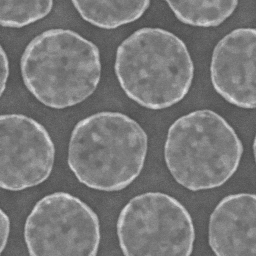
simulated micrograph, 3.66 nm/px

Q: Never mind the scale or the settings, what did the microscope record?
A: raised bodies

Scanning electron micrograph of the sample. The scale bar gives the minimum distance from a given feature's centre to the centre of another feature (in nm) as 344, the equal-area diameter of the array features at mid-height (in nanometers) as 282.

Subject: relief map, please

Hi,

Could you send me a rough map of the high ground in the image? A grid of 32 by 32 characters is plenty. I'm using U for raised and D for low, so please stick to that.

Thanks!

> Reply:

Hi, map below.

UUUUUUDDDUUUUUUUUUDDDUUUUUUUUDDD
UUUUUUDDDDUUUUUUUUDDDDUUUUUUUDDD
UUUUUDDDDDDUUUUUUDDDDDDUUUUUDDDD
DDDDDDDDDDDDDDDDDDDDDDDDDDDDDDDD
DDDDDUUUUUDDDDDDDUUUUUDDDDDDUUUU
DDDDUUUUUUUDDDDUUUUUUUUDDDDUUUUU
DDDUUUUUUUUUDDDUUUUUUUUDDDDUUUUU
UDDUUUUUUUUUDDDUUUUUUUUUDDUUUUUU
UDDUUUUUUUUUDDUUUUUUUUUUDDUUUUUU
UDDUUUUUUUUUDDDUUUUUUUUUDDUUUUUU
UDDUUUUUUUUUDDDUUUUUUUUUDDDUUUUU
DDDDUUUUUUUUDDDDUUUUUUUDDDDUUUUU
DDDDDUUUUUDDDDDDDUUUUUDDDDDDDUUU
DDDDDDDDDDDDDDDDDDDDDDDDDDDDDDDD
DUDDDDDDDDDDUUUUDDDDDDDUUUUDDDDD
UUUUUDDDDDUUUUUUUDDDDDUUUUUUDDDD
UUUUUUDDDUUUUUUUUUDDDUUUUUUUUDDD
UUUUUUDDDUUUUUUUUUDDDUUUUUUUUUDD
UUUUUUUDDUUUUUUUUUDDDUUUUUUUUUDD
UUUUUUUDDUUUUUUUUUDDDUUUUUUUUUDD
UUUUUUUDDUUUUUUUUUDDDUUUUUUUUUDD
UUUUUUDDDUUUUUUUUDDDDUUUUUUUUDDD
UUUUUDDDDDUUUUUUUDDDDDUUUUUUDDDD
DUUDDDDDDDDDUUDDDDDDDDDUUUDDDDDD
DDDDDDUUUDDDDDDDDDUUUDDDDDDDDUUU
DDDDDUUUUUUDDDDDUUUUUUDDDDDUUUUU
DDDDUUUUUUUUDDDUUUUUUUUDDDDUUUUU
UDDUUUUUUUUUDDDUUUUUUUUUDDUUUUUU
UDDUUUUUUUUUDDDUUUUUUUUUDDUUUUUU
UDDUUUUUUUUUDDDUUUUUUUUUDDUUUUUU
UDDUUUUUUUUUDDDUUUUUUUUUDDUUUUUU
DDDDUUUUUUUUDDDDUUUUUUUUDDDUUUUU